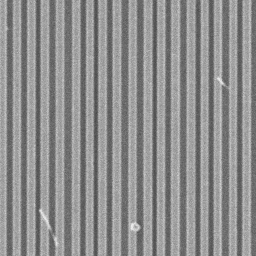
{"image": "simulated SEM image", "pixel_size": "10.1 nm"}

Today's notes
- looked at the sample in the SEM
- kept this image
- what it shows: parallel lines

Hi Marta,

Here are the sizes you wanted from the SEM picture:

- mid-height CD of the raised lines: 73.4 nm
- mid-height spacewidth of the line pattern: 0.0734 um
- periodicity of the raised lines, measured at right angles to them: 0.145 microns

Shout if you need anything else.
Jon